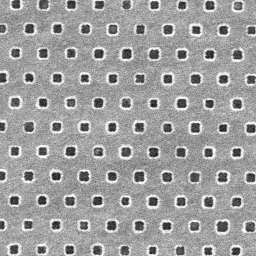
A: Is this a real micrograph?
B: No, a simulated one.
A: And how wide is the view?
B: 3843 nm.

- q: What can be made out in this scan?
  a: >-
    a regular array of holes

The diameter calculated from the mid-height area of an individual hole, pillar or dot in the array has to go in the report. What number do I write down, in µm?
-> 0.161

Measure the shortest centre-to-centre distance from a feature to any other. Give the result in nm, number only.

415